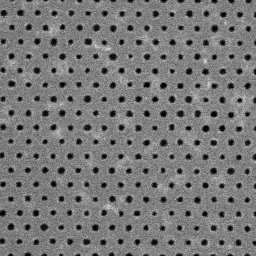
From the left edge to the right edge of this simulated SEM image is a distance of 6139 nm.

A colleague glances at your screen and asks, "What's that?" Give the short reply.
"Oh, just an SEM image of a regular array of holes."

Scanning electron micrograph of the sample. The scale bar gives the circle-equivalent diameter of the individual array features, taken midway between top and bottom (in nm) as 167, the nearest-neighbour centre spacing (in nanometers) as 388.